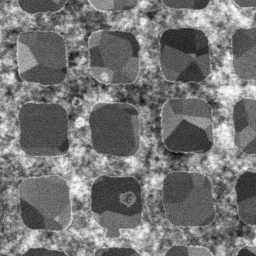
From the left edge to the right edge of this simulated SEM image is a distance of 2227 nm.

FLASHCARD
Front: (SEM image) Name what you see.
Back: a regular array of raised bodies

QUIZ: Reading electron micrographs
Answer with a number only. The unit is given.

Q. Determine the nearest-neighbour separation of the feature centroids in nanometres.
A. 618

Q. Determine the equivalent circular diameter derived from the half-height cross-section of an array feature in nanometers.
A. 497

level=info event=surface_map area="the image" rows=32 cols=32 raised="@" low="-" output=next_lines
--@@@@@@---@@@@@@----@@@@@----@@
---@@@@-------------------------
--------------------------------
-----------------------@------@@
--@@@@@@---@@@@@@---@@@@@@---@@@
--@@@@@@---@@@@@@---@@@@@@---@@@
--@@@@@@---@@@@@@---@@@@@@---@@@
--@@@@@@---@@@@@@---@@@@@@---@@@
--@@@@@@---@@@@@@---@@@@@@---@@@
---@@@@@----@@@@@---@@@@@@----@@
-----@@------@------------------
--------------------------------
---------@-----------@@@@-----@@
---@@@@@----@@@@@---@@@@@@---@@@
--@@@@@@---@@@@@@---@@@@@@@--@@@
--@@@@@@@--@@@@@@---@@@@@@@--@@@
--@@@@@@@--@@@@@@@--@@@@@@@--@@@
--@@@@@@@--@@@@@@@--@@@@@@@--@@@
---@@@@@@---@@@@@----@@@@@----@@
----@@@@------@@----------------
------------------------------@-
---------------------@@@@-----@@
---@@@@@----@@@@@---@@@@@@----@@
--@@@@@@@--@@@@@@@--@@@@@@---@@@
--@@@@@@@--@@@@@@@--@@@@@@@---@@
--@@@@@@@--@@@@@@@--@@@@@@@---@@
--@@@@@@@--@@@@@@@---@@@@@@---@@
---@@@@@@---@@@@@@---@@@@@@---@@
----@@@@-----@@@@---------------
-------------@@-----------------
--------------------------------
---@@@@@----@@@@@----@@@@@----@@